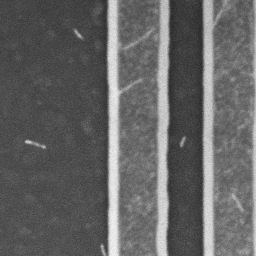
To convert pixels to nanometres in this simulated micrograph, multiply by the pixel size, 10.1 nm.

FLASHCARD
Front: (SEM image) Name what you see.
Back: one or a few lines or trenches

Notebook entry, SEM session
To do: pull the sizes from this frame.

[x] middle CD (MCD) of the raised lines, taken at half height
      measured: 494 nm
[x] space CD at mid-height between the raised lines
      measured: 462 nanometers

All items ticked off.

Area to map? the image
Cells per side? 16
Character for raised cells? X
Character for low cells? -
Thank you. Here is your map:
-------XXX---XXX
-------XXX---XXX
-------XXX---XXX
-------XXX---XXX
-------XXX---XXX
-------XXX---XXX
-------XXX---XXX
-------XXX---XXX
-------XXX---XXX
-------XXX---XXX
-------XXX---XXX
-------XXX---XXX
-------XXX---XXX
-------XXX---XXX
-------XXX---XXX
-------XXX---XXX